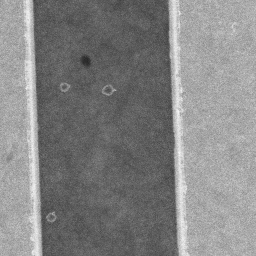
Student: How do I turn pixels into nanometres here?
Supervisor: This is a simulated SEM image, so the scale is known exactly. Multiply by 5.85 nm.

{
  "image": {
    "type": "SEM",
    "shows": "one or a few lines or trenches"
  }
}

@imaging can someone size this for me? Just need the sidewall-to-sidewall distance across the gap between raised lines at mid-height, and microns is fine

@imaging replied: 0.859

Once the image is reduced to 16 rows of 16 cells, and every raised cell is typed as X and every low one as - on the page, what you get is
XX---------XXXXX
XX---------XXXXX
XX---------XXXXX
XX---------XXXXX
XX---------XXXXX
XX---------XXXXX
XX---------XXXXX
XX---------XXXXX
XX---------XXXXX
XX---------XXXXX
XX---------XXXXX
XX---------XXXXX
XX---------XXXXX
XX---------XXXXX
XX---------XXXXX
XX---------XXXXX